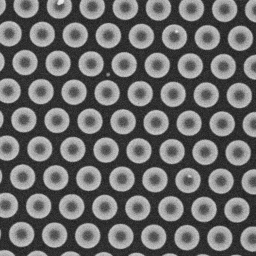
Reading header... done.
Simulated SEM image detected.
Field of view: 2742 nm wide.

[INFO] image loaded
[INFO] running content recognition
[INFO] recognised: an array of small figures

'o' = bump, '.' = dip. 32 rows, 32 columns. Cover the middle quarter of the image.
o...oooooo..oooooo..oooooo...ooo
o...ooooo...oooooo..oooooo...ooo
.....oooo....oooo....oooo....ooo
................................
.ooo.....ooo......o.............
ooooo...ooooo....oooo....ooooo..
oooooo..oooooo..oooooo..oooooo..
oooooo..oooooo..oooooo..oooooo..
ooooo...oooooo..oooooo..oooooo..
.ooo.....oooo....oooo....ooooo..
..........................oo....
.....ooo......oo................
o...ooooo...ooooo....oooo....ooo
o..oooooo...oooooo..oooooo...ooo
o..ooooooo..oooooo..oooooo..oooo
o...ooooo...oooooo..oooooo..oooo
....ooooo...ooooo....ooooo...ooo
......................oo......oo
.oo.............................
ooooo...ooooo....oooo....oooo...
ooooo...ooooo...oooooo..oooooo..
ooooo..ooooooo..oooooo..oooooo..
ooooo...ooooo...oooooo..oooooo..
oooo....ooooo...ooooo...oooooo..
.........oo.......oo.....oooo...
................................
....oooo....ooooo....oooo....ooo
o..oooooo...ooooo...oooooo..oooo
o..oooooo..ooooooo..oooooo..oooo
o..oooooo..oooooo...oooooo..oooo
....ooooo...ooooo...ooooo...oooo
......o......ooo.....ooo.....ooo